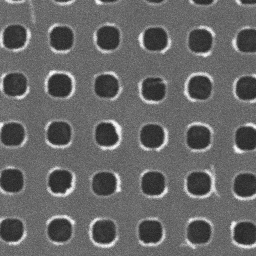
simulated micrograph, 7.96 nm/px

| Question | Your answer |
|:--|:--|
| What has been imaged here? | a regular array of holes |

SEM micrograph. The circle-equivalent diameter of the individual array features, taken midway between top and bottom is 0.204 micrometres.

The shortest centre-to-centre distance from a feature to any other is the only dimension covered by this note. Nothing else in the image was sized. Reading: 366 nm